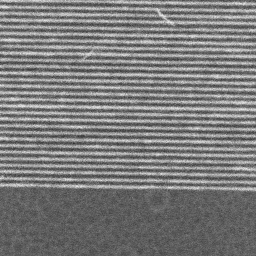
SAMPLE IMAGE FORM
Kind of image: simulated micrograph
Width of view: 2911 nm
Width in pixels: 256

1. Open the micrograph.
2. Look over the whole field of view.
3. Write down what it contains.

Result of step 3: parallel lines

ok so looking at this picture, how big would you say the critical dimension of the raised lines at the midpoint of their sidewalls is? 25.6 nm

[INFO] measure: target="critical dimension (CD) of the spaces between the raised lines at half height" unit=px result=4.63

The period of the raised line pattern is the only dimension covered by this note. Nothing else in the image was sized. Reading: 74.9 nm